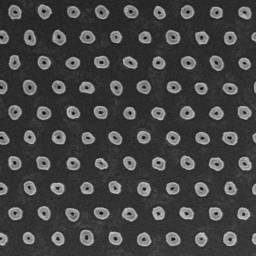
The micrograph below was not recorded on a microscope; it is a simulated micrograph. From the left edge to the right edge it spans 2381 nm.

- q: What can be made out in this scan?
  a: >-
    a regular array of ring-shaped raised bodies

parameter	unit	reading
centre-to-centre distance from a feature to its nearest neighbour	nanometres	260